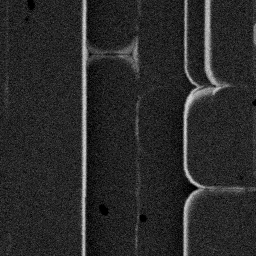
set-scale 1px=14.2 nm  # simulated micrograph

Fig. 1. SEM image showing wiring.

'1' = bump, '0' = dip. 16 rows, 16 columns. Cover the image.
1111100000000111
1111100000000111
1111100000000111
1111100000000111
1111100000000111
1111100000000111
1111100000001111
1111100000001111
1111100000001111
1111100000001111
1111100000001111
1111100000001111
1111100000001111
1111100000001111
1111100000001111
1111100000001111